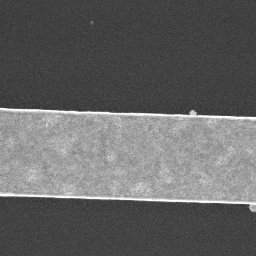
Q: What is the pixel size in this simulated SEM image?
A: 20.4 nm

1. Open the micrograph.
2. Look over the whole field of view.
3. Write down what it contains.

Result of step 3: one or a few lines or trenches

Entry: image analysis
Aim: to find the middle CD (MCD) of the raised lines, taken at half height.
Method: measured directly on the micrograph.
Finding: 1760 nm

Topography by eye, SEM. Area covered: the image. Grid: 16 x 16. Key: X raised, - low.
----------------
----------------
----------------
----------------
----------------
----------------
----------------
XXXXXXXXXXXXXXXX
XXXXXXXXXXXXXXXX
XXXXXXXXXXXXXXXX
XXXXXXXXXXXXXXXX
XXXXXXXXXXXXXXXX
---------XXXXXXX
----------------
----------------
----------------